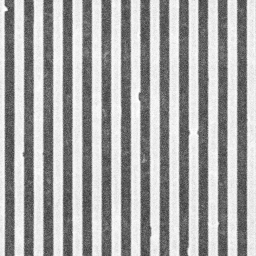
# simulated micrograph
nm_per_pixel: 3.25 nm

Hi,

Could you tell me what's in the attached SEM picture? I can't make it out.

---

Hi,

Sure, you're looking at parallel lines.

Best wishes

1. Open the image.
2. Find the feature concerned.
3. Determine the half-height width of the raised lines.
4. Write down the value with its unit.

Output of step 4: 28.1 nanometers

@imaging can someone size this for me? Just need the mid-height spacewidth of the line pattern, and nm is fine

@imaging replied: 34.2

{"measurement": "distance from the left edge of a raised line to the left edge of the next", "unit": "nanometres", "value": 63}